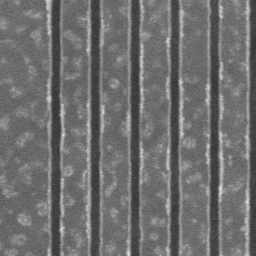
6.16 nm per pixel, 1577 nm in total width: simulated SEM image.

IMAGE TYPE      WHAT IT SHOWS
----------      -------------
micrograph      parallel lines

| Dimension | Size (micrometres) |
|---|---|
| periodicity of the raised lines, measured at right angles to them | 0.244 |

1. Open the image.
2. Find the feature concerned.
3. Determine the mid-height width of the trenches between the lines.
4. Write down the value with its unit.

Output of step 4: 61.6 nm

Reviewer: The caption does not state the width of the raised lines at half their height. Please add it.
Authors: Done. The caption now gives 0.183 um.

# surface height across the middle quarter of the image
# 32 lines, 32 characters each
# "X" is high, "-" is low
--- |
XXXXXX---XXXXXXX---XXXXXXX---XXX
XXXXXX---XXXXXXX---XXXXXXX---XXX
XXXXXX---XXXXXXX---XXXXXXX---XXX
XXXXXX---XXXXXXX---XXXXXXX---XXX
XXXXXX---XXXXXXX---XXXXXXX---XXX
XXXXXX---XXXXXXX---XXXXXXX---XXX
XXXXXX---XXXXXXX---XXXXXXX---XXX
XXXXXX---XXXXXXX---XXXXXXX---XXX
XXXXXX---XXXXXXX---XXXXXXX---XXX
XXXXXX---XXXXXXX---XXXXXXXX--XXX
XXXXXX---XXXXXXX---XXXXXXXX--XXX
XXXXXX---XXXXXXX---XXXXXXX---XXX
XXXXXX---XXXXXXX---XXXXXXX---XXX
XXXXXX---XXXXXXX---XXXXXXX---XXX
XXXXXX---XXXXXXX---XXXXXXX---XXX
XXXXXX---XXXXXXX---XXXXXXX---XXX
XXXXXX---XXXXXXX---XXXXXXX---XXX
XXXXXX---XXXXXXX---XXXXXXX---XXX
XXXXXX---XXXXXXX---XXXXXXX---XXX
XXXXXX---XXXXXXX---XXXXXXX---XXX
XXXXXX---XXXXXXX---XXXXXXX---XXX
XXXXXX---XXXXXXX---XXXXXXX---XXX
XXXXXX---XXXXXXX---XXXXXXX---XXX
XXXXXX---XXXXXXX---XXXXXXX---XXX
XXXXXX---XXXXXXX---XXXXXXX---XXX
XXXXXX---XXXXXXX---XXXXXXX---XXX
XXXXXX---XXXXXXXX--XXXXXXX---XXX
XXXXXX---XXXXXXXX--XXXXXXX---XXX
XXXXXX---XXXXXXX---XXXXXXX---XXX
XXXXXX---XXXXXXX---XXXXXXX---XXX
XXXXXX---XXXXXXX---XXXXXXX---XXX
XXXXXX---XXXXXXX---XXXXXXX---XXX